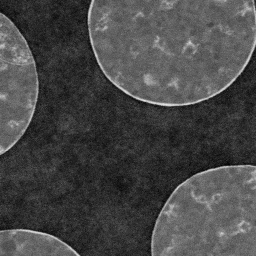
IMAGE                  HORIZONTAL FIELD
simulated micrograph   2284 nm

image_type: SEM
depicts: raised bodies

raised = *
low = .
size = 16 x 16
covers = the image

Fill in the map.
......**********
......**********
......**********
......**********
**.....********.
**......******..
**........**....
**..............
*...............
................
..............**
...........*****
...........*****
..........******
**........******
****.....*******